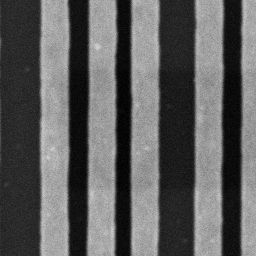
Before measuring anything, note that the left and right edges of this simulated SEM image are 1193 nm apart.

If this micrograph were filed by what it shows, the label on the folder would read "lines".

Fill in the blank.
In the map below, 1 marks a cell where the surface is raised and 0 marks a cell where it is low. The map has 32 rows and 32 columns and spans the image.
00000111000111001111000011110011
00000111100111001111000011110011
00000111100111000111000001110011
00000111100111101111000001110011
00000111100111101111000011110011
00000111100111001111000011110011
00000111100111001111000011110011
00000111100111001111000011110011
00000111100111001111000011110011
00000111100111001111000011110011
00000111100111001111000011110011
00000111100111001111000011110011
00000111100111000111000011110011
00000111100111000111000001110011
00000111100111001111000001110011
00000111100111000111000011110011
00000111100111001111000011110011
00000111100111001111000011110011
00000111100111001111000011110011
00000111100111001111000011110011
00000111100111001111000011110011
00000111000111001111000011110011
00000111000111001111000011110011
00000111000111001111000011110011
00000111000111001111000011110011
00000111000111001111000011110011
00000111000111001111000011110011
00000111100111001111000011110011
00000111100111001111000011110011
00000111100111001111000011110011
00000111100111001111000011110011
00000111100111001111000011110011